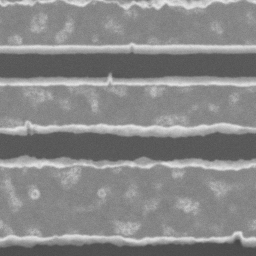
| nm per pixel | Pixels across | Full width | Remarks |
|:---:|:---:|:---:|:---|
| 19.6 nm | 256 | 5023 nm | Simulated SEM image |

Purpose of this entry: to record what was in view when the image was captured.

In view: one or a few lines or trenches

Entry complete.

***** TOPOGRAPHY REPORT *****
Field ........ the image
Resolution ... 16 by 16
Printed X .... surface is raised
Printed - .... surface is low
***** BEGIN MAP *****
XXXXXXXXXXXXXXXX
XXXXXXXXXXXXXXXX
XXXXXXXXXXXXXXXX
----------------
----------------
XXXXXXXXXXXXXXXX
XXXXXXXXXXXXXXXX
XXXXXXXXXXXXXXXX
----------------
----------------
XXXXXXXXXXXXXXXX
XXXXXXXXXXXXXXXX
XXXXXXXXXXXXXXXX
XXXXXXXXXXXXXXXX
XXXXXXXXXXXXXXXX
----------------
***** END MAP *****